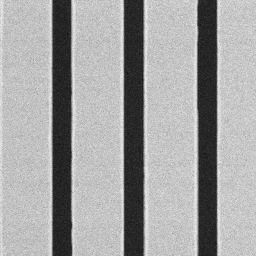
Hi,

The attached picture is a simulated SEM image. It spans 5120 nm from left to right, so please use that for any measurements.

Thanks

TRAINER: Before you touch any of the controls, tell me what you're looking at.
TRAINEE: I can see lines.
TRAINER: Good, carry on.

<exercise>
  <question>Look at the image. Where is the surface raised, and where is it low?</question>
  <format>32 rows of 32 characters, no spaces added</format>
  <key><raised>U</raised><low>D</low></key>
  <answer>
UUUUUUDDDUUUUUUDDDUUUUUUUDDUUUUU
UUUUUUDDDUUUUUUDDDUUUUUUUDDUUUUU
UUUUUUDDDUUUUUUDDDUUUUUUUDDUUUUU
UUUUUUDDDUUUUUUDDDUUUUUUUDDUUUUU
UUUUUUDDDUUUUUUDDDUUUUUUUDDUUUUU
UUUUUUDDDUUUUUUDDDUUUUUUUDDUUUUU
UUUUUUDDDUUUUUUDDDUUUUUUUDDUUUUU
UUUUUUDDDUUUUUUDDDUUUUUUUDDUUUUU
UUUUUUDDDUUUUUUDDDUUUUUUUDDUUUUU
UUUUUUDDDUUUUUUDDDUUUUUUUDDUUUUU
UUUUUUDDDUUUUUUDDDUUUUUUUDDUUUUU
UUUUUUDDDUUUUUUDDDUUUUUUUDDUUUUU
UUUUUUDDDUUUUUUDDDUUUUUUUDDUUUUU
UUUUUUDDDUUUUUUDDDUUUUUUUDDUUUUU
UUUUUUDDDUUUUUUDDDUUUUUUUDDUUUUU
UUUUUUDDDUUUUUUDDDUUUUUUUDDUUUUU
UUUUUUDDDUUUUUUDDDUUUUUUUDDUUUUU
UUUUUUDDDUUUUUUDDDUUUUUUUDDUUUUU
UUUUUUDDDUUUUUUDDDUUUUUUUDDUUUUU
UUUUUUDDDUUUUUUDDDUUUUUUUDDUUUUU
UUUUUUDDDUUUUUUDDDUUUUUUUDDUUUUU
UUUUUUDDDUUUUUUDDDUUUUUUUDDUUUUU
UUUUUUDDDUUUUUUDDDUUUUUUUDDUUUUU
UUUUUUDDDUUUUUUDDDUUUUUUUDDUUUUU
UUUUUUDDDUUUUUUDDDUUUUUUUDDUUUUU
UUUUUUDDDUUUUUUDDDUUUUUUUDDUUUUU
UUUUUUDDDUUUUUUDDDUUUUUUUDDUUUUU
UUUUUUDDDUUUUUUDDDUUUUUUUDDUUUUU
UUUUUUDDDUUUUUUDDDUUUUUUUDDUUUUU
UUUUUUDDDUUUUUUDDDUUUUUUUDDUUUUU
UUUUUUDDDUUUUUUDDDUUUUUUUDDUUUUU
UUUUUUDDDUUUUUUDDDUUUUUUUDDUUUUU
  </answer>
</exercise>